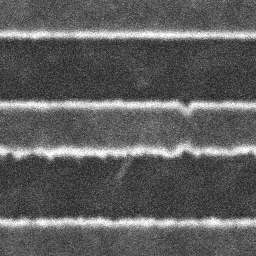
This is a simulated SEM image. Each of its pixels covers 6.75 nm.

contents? one or a few lines or trenches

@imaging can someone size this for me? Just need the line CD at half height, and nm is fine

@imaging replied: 326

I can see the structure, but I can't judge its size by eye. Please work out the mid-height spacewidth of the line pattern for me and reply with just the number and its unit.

68.8 px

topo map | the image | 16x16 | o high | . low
oooooooooooooooo
oooooooooooooooo
................
................
................
................
................
oooooooooooooooo
oooooooooooooooo
ooooooooooo.ooo.
................
................
................
................
oooooooooooooooo
oooooooooooooooo